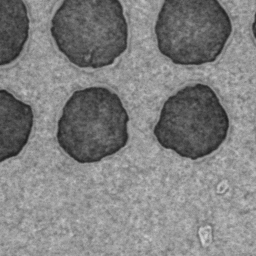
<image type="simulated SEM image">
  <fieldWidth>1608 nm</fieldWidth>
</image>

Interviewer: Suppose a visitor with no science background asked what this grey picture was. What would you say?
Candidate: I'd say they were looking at holes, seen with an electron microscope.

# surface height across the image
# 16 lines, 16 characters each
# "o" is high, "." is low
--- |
..oo....oo....oo
..o.....oo....oo
..o.....oo....oo
.ooo...ooo....oo
oooooooooooooooo
oooooo.oooo..ooo
..oo....oo....oo
..oo....oo....oo
..oo....oo....oo
.ooo...oooo..ooo
oooooooooooooooo
oooooooooooooooo
oooooooooooooooo
oooooooooooooooo
oooooooooooooooo
oooooooooooooooo